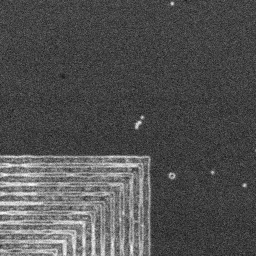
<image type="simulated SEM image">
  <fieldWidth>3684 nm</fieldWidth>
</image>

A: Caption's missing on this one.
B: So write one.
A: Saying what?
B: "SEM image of groups of lines, slits or small figures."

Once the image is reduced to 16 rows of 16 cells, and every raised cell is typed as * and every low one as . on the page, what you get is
****************
****************
****************
****************
****************
****************
****************
****************
****************
****************
.........*******
.........*******
.........*******
.........*******
.........*******
.........*******